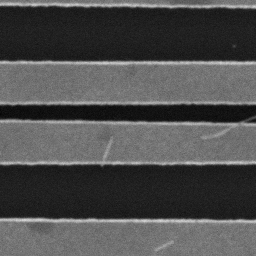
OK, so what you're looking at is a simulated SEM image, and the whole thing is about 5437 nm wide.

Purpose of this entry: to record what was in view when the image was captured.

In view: lines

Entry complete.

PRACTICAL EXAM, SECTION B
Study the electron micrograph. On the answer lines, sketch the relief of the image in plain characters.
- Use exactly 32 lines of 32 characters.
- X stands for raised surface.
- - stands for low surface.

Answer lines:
XXXXXXXXXXXXXXXXXXXXXXXXXXXXXXXX
--------------------------------
--------------------------------
--------------------------------
--------------------------------
--------------------------------
--------------------------------
--------------------------------
XXXXXXXXXXXXXXXXXXXXXXXXXXXXXXXX
XXXXXXXXXXXXXXXXXXXXXXXXXXXXXXXX
XXXXXXXXXXXXXXXXXXXXXXXXXXXXXXXX
XXXXXXXXXXXXXXXXXXXXXXXXXXXXXXXX
XXXXXXXXXXXXXXXXXXXXXXXXXXXXXXXX
--------------------------------
--------------------------------
XXXXXXXXXXXXXXXXXXXXXXXXXXXXXXX-
XXXXXXXXXXXXXXXXXXXXXXXXXXXXXXXX
XXXXXXXXXXXXXXXXXXXXXXXXXXXXXXXX
XXXXXXXXXXXXXXXXXXXXXXXXXXXXXXXX
XXXXXXXXXXXXXXXXXXXXXXXXXXXXXXXX
--------------------------------
--------------------------------
--------------------------------
--------------------------------
--------------------------------
--------------------------------
--------------------------------
-X------------------------------
XXXXXXXXXXXXXXXXXXXXXXXXXXXXXXXX
XXXXXXXXXXXXXXXXXXXXXXXXXXXXXXXX
XXXXXXXXXXXXXXXXXXXXXXXXXXXXXXXX
XXXXXXXXXXXXXXXXXXXXXXXXXXXXXXXX